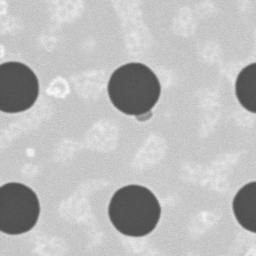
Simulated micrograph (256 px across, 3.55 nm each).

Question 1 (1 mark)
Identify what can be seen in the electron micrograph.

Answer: holes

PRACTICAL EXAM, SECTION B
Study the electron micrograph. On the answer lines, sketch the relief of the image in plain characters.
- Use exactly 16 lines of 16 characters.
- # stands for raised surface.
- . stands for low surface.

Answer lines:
################
################
################
################
..#####...#####.
..#####...#####.
..#####...#####.
################
################
################
################
.##############.
..#####...#####.
..#####...#####.
..######.#######
################